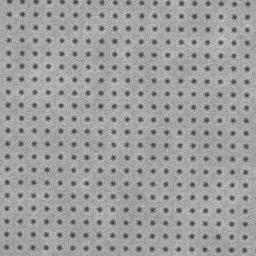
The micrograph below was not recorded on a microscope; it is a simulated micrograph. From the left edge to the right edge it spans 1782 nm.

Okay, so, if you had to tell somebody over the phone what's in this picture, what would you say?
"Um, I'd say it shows a regular array of holes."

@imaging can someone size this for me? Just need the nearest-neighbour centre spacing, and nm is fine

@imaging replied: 87.5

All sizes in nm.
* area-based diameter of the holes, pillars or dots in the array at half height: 38.5